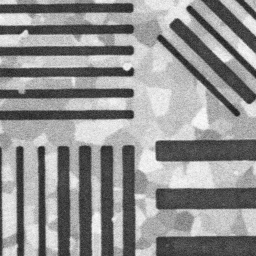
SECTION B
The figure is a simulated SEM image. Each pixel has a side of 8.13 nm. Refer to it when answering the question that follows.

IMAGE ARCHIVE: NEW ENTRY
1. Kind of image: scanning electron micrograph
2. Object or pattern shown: groups of lines, slits or small figures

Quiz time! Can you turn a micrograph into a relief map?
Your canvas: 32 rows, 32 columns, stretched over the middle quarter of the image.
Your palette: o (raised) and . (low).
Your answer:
oooooooooooooooooooooooooooooo..
..................ooooooooooooo.
.................ooooooooooooooo
.......ooooooooooooooooooooooooo
oooooooooooooooooooooooooooooooo
oooooooooooooooooooooooooooooooo
.................ooooooooooooooo
..................oooooooooooooo
.................ooooooooooooooo
oooooooooooooooooooooooooooooooo
oooooooooooooooooooooooooooooooo
.................ooooooooooooooo
..................oooooooooooooo
.................ooooooooooooooo
oooooooooooooooooooooooooooooooo
oooooooooooooooooooooooooooooooo
oooooooooooooooooooooooooooooooo
oooooooooooooooooooooooooooooooo
oooooooooooooooooooooooooooooooo
ooooooooooooooooooooooo.........
.ooo..ooo...ooo...ooooo.........
.oo....oo...oo....ooooo.........
.oo....oo....o....ooooo.........
.oo....oo....o....ooooo.........
.ooo...oo....o....ooooo.........
.ooo...oo....o....oooooooooooooo
.ooo...oo....o....oooooooooooooo
.ooo...oo....o....oooooooooooooo
..oo...oo....o....oooooooooooooo
..oo...oo....o....oooooooooooooo
..oo...oo....o....oooooooooooooo
..oo...oo....o....ooooo.........